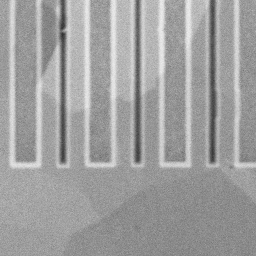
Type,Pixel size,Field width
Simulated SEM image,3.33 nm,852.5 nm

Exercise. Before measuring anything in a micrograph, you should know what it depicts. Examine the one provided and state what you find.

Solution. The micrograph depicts parallel lines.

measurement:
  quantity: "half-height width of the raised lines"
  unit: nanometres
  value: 69.9